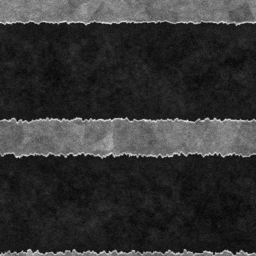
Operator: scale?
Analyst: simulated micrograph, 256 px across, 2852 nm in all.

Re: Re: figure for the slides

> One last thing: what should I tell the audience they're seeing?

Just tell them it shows one or a few lines or trenches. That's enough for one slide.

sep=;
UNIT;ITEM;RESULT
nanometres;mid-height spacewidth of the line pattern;1080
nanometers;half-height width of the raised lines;388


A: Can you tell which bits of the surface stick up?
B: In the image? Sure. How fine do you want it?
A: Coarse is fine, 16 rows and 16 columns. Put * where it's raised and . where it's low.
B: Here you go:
****************
................
................
................
................
................
................
*.******........
****************
****************
................
................
................
................
................
................